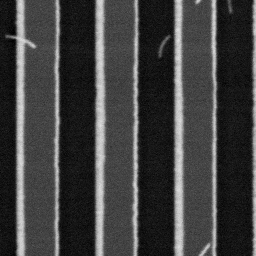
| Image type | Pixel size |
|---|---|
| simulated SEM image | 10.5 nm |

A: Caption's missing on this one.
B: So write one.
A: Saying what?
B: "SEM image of lines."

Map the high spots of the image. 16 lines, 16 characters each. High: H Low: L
LHHHLLHHHLLHHLLL
LHHHLLHHHLLHHLLL
LHHHLLHHHLLHHLLL
LHHHLLHHHLLHHLLL
LHHHLLHHHLLHHLLL
LHHHLLHHHLLHHLLL
LHHHLLHHHLLHHLLL
LHHHLLHHHLLHHLLL
LHHHLLHHHLLHHLLL
LHHHLLHHHLLHHLLL
LHHHLLHHHLLHHLLL
LHHHLLHHHLLHHLLL
LHHHLLHHHLLHHLLL
LHHHLLHHHLLHHLLL
LHHHLLHHHLLHHLLL
LHHHLLHHHLLHHLLL